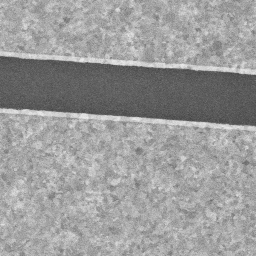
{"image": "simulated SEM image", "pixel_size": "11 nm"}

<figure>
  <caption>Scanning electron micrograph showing one or a few lines or trenches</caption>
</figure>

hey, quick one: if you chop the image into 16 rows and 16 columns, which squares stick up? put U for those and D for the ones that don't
UUUUUUUUUUUUUUUU
UUUUUUUUUUUUUUUU
UUUUUUUUUUUUUUUU
DDUUUUUUUUUUUUUU
DDDDDDDDDDDDDDDD
DDDDDDDDDDDDDDDD
DDDDDDDDDDDDDDDD
UUUUUUUUUDDDDDDD
UUUUUUUUUUUUUUUU
UUUUUUUUUUUUUUUU
UUUUUUUUUUUUUUUU
UUUUUUUUUUUUUUUU
UUUUUUUUUUUUUUUU
UUUUUUUUUUUUUUUU
UUUUUUUUUUUUUUUU
UUUUUUUUUUUUUUUU